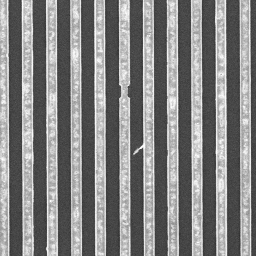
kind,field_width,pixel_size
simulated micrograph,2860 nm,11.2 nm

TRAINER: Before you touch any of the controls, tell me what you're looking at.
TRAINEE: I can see parallel lines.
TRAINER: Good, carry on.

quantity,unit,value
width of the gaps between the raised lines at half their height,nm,166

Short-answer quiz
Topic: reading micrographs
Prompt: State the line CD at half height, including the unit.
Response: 110 nanometres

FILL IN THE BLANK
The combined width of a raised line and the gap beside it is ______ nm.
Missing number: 270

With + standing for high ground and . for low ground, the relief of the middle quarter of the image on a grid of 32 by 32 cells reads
..++....++....++....++....++....
..++....++....++....++....++....
..++....++....++....++....++....
..++....++....++....++....++....
..++....++....++....++....++....
..++....++....++....++....++....
..++....++....++....++....++....
..++....++....++....++....++....
..++....++....++....++....++....
..++....++....++....++....++....
..++....++....++....++....++....
..++....++....++....++....++....
..++....++....++....++....++....
..++....++....++....++....++....
..++....++....++....++....++....
..++....++....++....++....++....
..++....++....++....++....++....
..++....++....++....++....++....
..++....++....++....++....++....
..++....++....++....++....++....
..++....++....++....++....++....
..++....++....++....++....++....
..++....++....++....++....++....
..++....++....++....++....++....
..++....++....++....++....++....
..++....++....++....++....++....
..++....++....++....++....++....
..++....++....++....++....++....
..++....++....++....++....++....
..++....++....++....++....++....
..++....++....++....++....++....
..++....++....++....++....++....